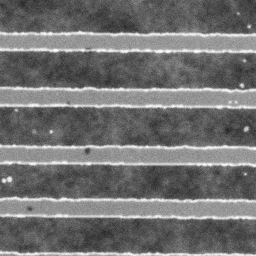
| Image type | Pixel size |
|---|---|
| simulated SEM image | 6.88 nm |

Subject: lines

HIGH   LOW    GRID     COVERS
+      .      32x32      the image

................................
................................
................................
................................
++++++++++++++++++++++++++++++++
++++++++++++++++++++++++++++++++
...............+...+++..++++++++
................................
................................
................................
................................
++++++++++++++++++++++++++++++++
++++++++++++++++++++++++++++++++
................................
................................
................................
................................
................................
++++++++++++++++++++++++++++++++
++++++++++++++++++++++++++++++++
...++......+.+++++++++++++++++++
................................
................................
................................
................................
++++++++++++++++++++++++++++++++
++++++++++++++++++++++++++++++++
................................
................................
................................
................................
................................